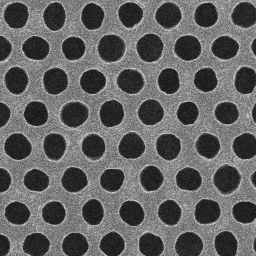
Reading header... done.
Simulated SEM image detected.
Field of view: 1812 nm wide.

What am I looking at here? a regular array of holes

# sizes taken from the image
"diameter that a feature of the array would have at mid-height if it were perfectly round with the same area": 177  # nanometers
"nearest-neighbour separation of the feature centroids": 37.1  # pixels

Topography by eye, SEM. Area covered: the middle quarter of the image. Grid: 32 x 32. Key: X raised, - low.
XXXXXXXXXXXXXXXXXXXXXXXXXXXXXXXX
XXXXXX--XXXXXXX---XXXXXXX---XXXX
XXXXX-----XXXX-----XXXXX----XXXX
-XXX------XXX-------XXXX-----XXX
-XXX------XXX-------XXX------XXX
-XXX------XXX-------XXXX-----XXX
XXXXX----XXXXX-----XXXXX----XXXX
XXXXXXX-XXXXXXXX--XXXXXXXXXXXXXX
XXXXXXXXXXXXXXXXXXXXXXXXXXXXXXXX
XXXXXXXXXX----XXXXXX----XXXXXX--
-----XXXX------XXXX-----XXXXX---
------XXX------XXXX------XXX----
------XXX------XXXX------XXX----
------XXX------XXXX------XXX----
-----XXXX-----XXXXXX----XXXXX---
X---XXXXXX---XXXXXXXXXXXXXXXXXXX
XXXXXXXXXXXXXXXXXXXXXXXXXXXXXXXX
XXXXXXXXXXXXXXXX--XXXXXXX--XXXXX
XXXXX----XXXXX-----XXXX------XXX
XXXXX-----XXXX------XXX------XXX
-XXX------XXXX------XXX------XXX
XXXX------XXXX------XXX------XXX
XXXXX-----XXXX------XXXX-----XXX
XXXXXXX--XXXXXX---XXXXXXX---XXXX
XXXXXXXXXXXXXXXXXXXXXXXXXXXXXXXX
XXXXXXXXXXXXXXXXXXXXXXXXXXXXXXXX
X---XXXXXXX---XXXXXX----XXXXX---
-----XXXXX-----XXXX-----XXXX----
------XXX------XXXX------XXX----
------XXX------XXXX------XXX----
-----XXXX-----XXXXXX----XXXX----
X---XXXXXXX---XXXXXXX--XXXXXXX--